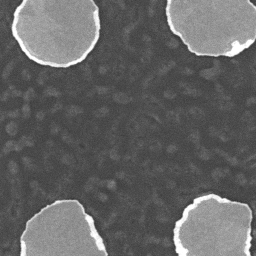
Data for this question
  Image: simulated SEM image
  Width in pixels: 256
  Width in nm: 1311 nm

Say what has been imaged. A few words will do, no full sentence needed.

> raised bodies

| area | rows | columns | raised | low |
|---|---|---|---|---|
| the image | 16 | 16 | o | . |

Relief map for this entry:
.ooooo....oooooo
.ooooo.....ooooo
.ooooo.....ooooo
..ooo...........
................
................
................
................
................
................
................
................
............oo..
..oooo.....ooooo
.ooooo.....ooooo
.oooooo....ooooo